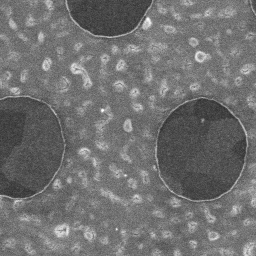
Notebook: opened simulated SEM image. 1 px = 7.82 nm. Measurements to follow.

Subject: raised bodies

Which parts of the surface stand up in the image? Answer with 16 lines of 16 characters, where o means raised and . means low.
....ooooo.......
.....oooo.......
................
................
................
................
ooo........ooo..
oooo......ooooo.
oooo......ooooo.
oooo......ooooo.
oooo......ooooo.
ooo.......ooooo.
............o...
................
................
................